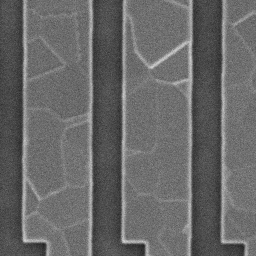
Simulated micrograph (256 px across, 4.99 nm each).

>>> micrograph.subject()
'wiring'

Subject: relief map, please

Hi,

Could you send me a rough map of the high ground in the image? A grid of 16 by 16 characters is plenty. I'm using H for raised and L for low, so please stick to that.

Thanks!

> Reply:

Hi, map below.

LHHHHHLLHHHHLLHH
LHHHHHLLHHHHLLHH
LHHHHHLLHHHHLLHH
LHHHHHLLHHHHLLHH
LHHHHHLLHHHHLLHH
LHHHHHLLHHHHLLHH
LHHHHHLLHHHHLLHH
LHHHHHLLHHHHLLHH
LHHHHHLLHHHHLLHH
LHHHHHLLHHHHLLHH
LHHHHHLLHHHHLLHH
LHHHHHLLHHHHLLHH
LHHHHHLLHHHHLLHH
LHHHHHLLHHHHLLHH
LHHHHHLLHHHHLLHH
LLLHHHLLLHHHLLLH